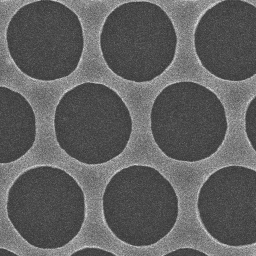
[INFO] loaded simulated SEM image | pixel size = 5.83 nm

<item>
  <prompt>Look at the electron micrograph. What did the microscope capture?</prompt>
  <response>holes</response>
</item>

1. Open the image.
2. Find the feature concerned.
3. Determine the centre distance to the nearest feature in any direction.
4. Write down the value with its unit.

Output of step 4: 549 nm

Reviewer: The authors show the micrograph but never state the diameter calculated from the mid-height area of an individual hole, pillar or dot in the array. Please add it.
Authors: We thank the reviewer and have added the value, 461 nanometers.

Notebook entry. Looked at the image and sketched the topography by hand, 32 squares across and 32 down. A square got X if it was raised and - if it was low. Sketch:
XXXX----XXXXXXX----XXXXXXXX----X
XX-------XXXXX-------XXXXX------
X---------XXX--------XXXX-------
X---------XXX---------XX--------
X---------XXX---------XX--------
X----------X----------XX--------
X---------XXX---------XX--------
XX--------XXX---------XXX-------
XX--------XXXX-------XXXXX------
XXX-----XXXXXXX-----XXXXXXX-----
XXXXXXXXXX---XXXXXXXX----XXXXXXX
--XXXXXX------XXXXXX-------XXXXX
---XXXXX-------XXXX--------XXXX-
----XXX---------XXX---------XXX-
----XXX---------XXX---------XXX-
-----XX---------XXX---------XXX-
-----XX---------XXX---------XXX-
----XXX---------XXX---------XXX-
----XXXX--------XXXX-------XXXXX
---XXXXXX------XXXXXX-----XXXXXX
XXXXXXXXXXX-XXXXXXXXXXXXXXXXXXXX
XXX-----XXXXXXX-----XXXXXXX-----
XX-------XXXXX-------XXXXX------
X---------XXX---------XXX-------
X---------XXX---------XXX-------
X----------XX---------XXX-------
X----------XX---------XXX-------
X---------XXX---------XXX-------
XX--------XXXX--------XXXX------
XXX------XXXXX-------XXXXX------
XXXX----XXXXXXXX---XXXXXXXXX----
-XXXXXXXX-----XXXXXXX----XXXXXXX